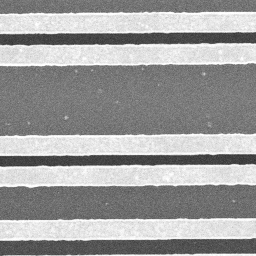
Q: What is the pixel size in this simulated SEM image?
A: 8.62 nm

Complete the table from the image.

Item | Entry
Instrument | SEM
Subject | lines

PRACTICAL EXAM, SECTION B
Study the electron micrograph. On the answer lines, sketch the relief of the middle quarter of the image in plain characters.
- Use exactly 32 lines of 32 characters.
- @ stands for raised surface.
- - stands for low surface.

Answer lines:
--------------------------------
--------------------------------
--------------------------------
--------------------------------
--------------------------------
--------------------------------
--------------------------------
--------------------------------
--------------------------------
--------------------------------
--------------------------------
--------------------------------
--------------------------------
--------------------------------
--------------------------------
--------------------------------
--------------------------------
--------------------------------
@@@@@@@@@@@@@@@@@@@@@@@@@@@@@@@@
@@@@@@@@@@@@@@@@@@@@@@@@@@@@@@@@
@@@@@@@@@@@@@@@@@@@@@@@@@@@@@@@@
@@@@@@@@@@@@@@@@@@@@@@@@@@@@@@@@
@@@@@@@@@@@@@@@@@@@@@@@@@@@@@@@@
--------------------------------
--------------------------------
--------------@@@@@@---@@@@@@@@@
@@@@@@@@@@@@@@@@@@@@@@@@@@@@@@@@
@@@@@@@@@@@@@@@@@@@@@@@@@@@@@@@@
@@@@@@@@@@@@@@@@@@@@@@@@@@@@@@@@
@@@@@@@@@@@@@@@@@@@@@@@@@@@@@@@@
--------------------------------
--------------------------------